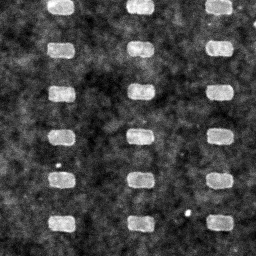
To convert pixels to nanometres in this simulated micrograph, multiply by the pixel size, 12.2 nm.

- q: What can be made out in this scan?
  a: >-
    a regular array of raised bodies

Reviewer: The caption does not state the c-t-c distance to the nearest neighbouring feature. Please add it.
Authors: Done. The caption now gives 528 nanometres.